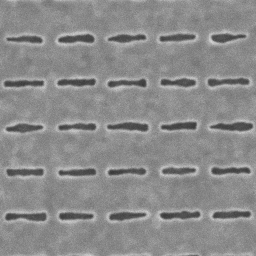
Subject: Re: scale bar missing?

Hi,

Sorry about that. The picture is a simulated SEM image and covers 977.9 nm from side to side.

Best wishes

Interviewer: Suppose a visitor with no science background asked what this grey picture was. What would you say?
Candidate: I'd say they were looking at a regular array of holes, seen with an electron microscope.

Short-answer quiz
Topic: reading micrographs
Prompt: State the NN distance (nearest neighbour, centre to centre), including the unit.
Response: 168 nanometres